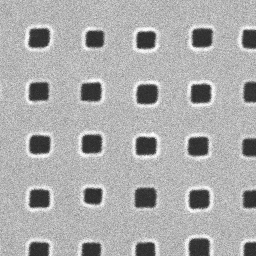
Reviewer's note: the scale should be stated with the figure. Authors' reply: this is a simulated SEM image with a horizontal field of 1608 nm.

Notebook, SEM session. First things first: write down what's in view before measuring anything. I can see a regular array of holes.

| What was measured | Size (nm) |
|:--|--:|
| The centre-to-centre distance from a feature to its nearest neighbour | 328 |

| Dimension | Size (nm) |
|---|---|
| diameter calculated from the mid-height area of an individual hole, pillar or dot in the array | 141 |